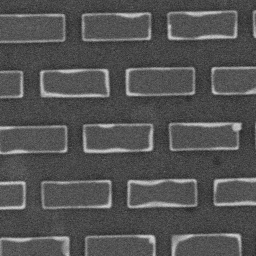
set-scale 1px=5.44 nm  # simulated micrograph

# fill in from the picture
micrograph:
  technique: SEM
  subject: groups of lines, slits or small figures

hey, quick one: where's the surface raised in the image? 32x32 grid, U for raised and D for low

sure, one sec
DDDDDDDDDDDDDDDDDDDDDDDDDDDDDDDD
DDDDDDDDDDDDDDDDDDDDDDDDDDDUUDDD
UUUUUUUUDDUUUUUUUUUDDUUUUUUUUDDD
UUUUUUUUDDUUUUUUUUUDDUUUUUUUUDDD
UUUUUUUUDDUUUUUUUUUDDUUUUUUUUDDD
DDDDDDDDDDDDDDDDDDDDDDDDDDDDDDDD
DDDDDDDDDDDDDDDDDDDDDDDDDDDDDDDD
DDDDDDDDDDDDDDDDDDDDDDDDDDDDDDDD
DDDDDDDDDDDDDDDDDDDDDDDDDDDDDDDD
UUUDDUUUUUUUUDDDUUUUUUUUDDDUUUUU
UUUDDUUUUUUUUDDDUUUUUUUUDDDUUUUU
UUUDDUUUUUUUUUDDUUUUUUUUDDDUUUUD
DDDDDDDDDDDDDDDDDDDDDDDDDDDDDDDD
DDDDDDDDDDDDDDDDDDDDDDDDDDDDDDDD
DDDDDDDDDDDDDDDDDDDDDDDDDDDDDDDD
DDDDDDDDDDDDDDDDDDDDDDUDDDDDUUDD
UUUUUUUUDDDUUUUUUUUDDUUUUUUUUUDD
UUUUUUUUDDDUUUUUUUUDDUUUUUUUUUDD
UUUUUUUUDDDUUUUUUUUDDUUUUUUUUDDD
DDDDDDDDDDDDDDDDDDDDDDDDDDDDDDDD
DDDDDDDDDDDDDDDDDDDDDDDDDDDDDDDD
DDDDDDDDDDDDDDDDDDDDDDDDDDDDDDDD
DDDDDDDDDDDDDDDDDDDDDDDDDDDDDUDD
UUUDDUUUUUUUUUDDUUUUUUUUUDDUUUUU
UUUDDUUUUUUUUUDDUUUUUUUUUDDUUUUU
UUUDDUUUUUUUUUDDUUUDUUUUDDDUDDDD
DDDDDDDDDDDDDDDDDDDDDDDDDDDDDDDD
DDDDDDDDDDDDDDDDDDDDDDDDDDDDDDDD
DDDDDDDDDDDDDDDDDDDDDDDDDDDDDDDD
DDDDDDDDDDDDDDUUUUDDDDDDUUUUUUDD
UUUUUUUUDDDUUUUUUUUDDDUUUUUUUUDD
UUUUUUUUDDDUUUUUUUUDDDUUUUUUUUDD